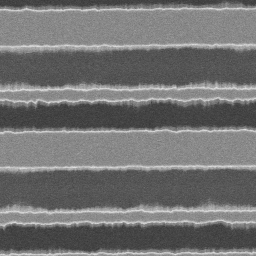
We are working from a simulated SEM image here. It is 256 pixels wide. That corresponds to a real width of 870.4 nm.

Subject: lines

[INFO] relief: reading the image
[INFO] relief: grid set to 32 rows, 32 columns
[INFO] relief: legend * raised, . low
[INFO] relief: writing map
................................
********************************
********************************
********************************
********************************
********************************
................................
................................
................................
................................
................................
********************************
*******************...**.*..***.
................................
................................
................................
********************************
********************************
********************************
********************************
********************************
................................
................................
................................
................................
................................
******.*************************
********************************
................................
................................
................................
................................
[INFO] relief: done